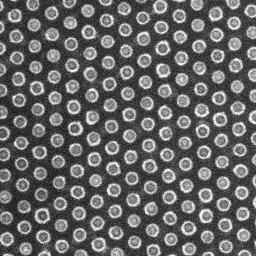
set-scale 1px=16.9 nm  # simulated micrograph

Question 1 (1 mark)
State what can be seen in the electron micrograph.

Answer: a regular array of holes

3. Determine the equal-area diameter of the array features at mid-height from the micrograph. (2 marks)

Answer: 10.5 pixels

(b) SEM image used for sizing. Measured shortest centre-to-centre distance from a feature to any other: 350 nanometers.